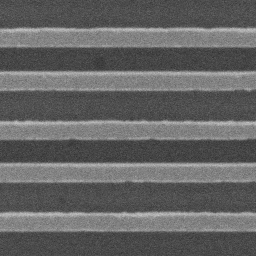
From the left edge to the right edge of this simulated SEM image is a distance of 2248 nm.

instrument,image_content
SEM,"lines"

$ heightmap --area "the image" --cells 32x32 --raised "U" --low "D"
DDDDDDDDDDDDDDDDDDDDDDDDDDDDDDDD
DDDDDDDDDDDDDDDDDDDDDDDDDDDDDDDD
DDDDDDDDDDDDDDDDDDDDDDDDDDDDDDDD
DDDDDDDDDDDDDDDDDDDDDDDDDDDDDDDD
UUUUUUUUUUUUUUUUUUUUUUUUUUUUUUUU
UUUUUUUUUUUUUUUUUUUUUUUUUUUUUUUU
DDDDDDDDDDDDDDDDDDDDDDDDDDDDDDDD
DDDDDDDDDDDDDDDDDDDDDDDDDDDDDDDD
DDDDDDDDDDDDDDDDDDDDDDDDDDDDDDDD
UUUUUUUUUUUUUUUUUUUUUUUUUUUUUUUU
UUUUUUUUUUUUUUUUUUUUUUUUUUUUUUUU
DDDDDDDDDDDDDDDDDDDDDDDDDDDDDDDD
DDDDDDDDDDDDDDDDDDDDDDDDDDDDDDDD
DDDDDDDDDDDDDDDDDDDDDDDDDDDDDDDD
DDDDDDDDDDDDDDDDDDDDDDDDDDDDDDDD
UUUUUUUUUUUUUUUUUUUUUUUUUUUUUUUU
UUUUUUUUUUUUUUUUUUUUUUUUUUUUUUUU
DDDDDDDDDDDDDDDDDDDDDDDDDDDDDDDD
DDDDDDDDDDDDDDDDDDDDDDDDDDDDDDDD
DDDDDDDDDDDDDDDDDDDDDDDDDDDDDDDD
UUUUUUUUUUDDUUUUDUUUUUUDDUUUDUUU
UUUUUUUUUUUUUUUUUUUUUUUUUUUUUUUU
UUUUUUUUUUUUUUUUUUUUUUUUUUUUUUUU
DDDDDDDDDDDDDDDDDDDDDDDDDDDDDDDD
DDDDDDDDDDDDDDDDDDDDDDDDDDDDDDDD
DDDDDDDDDDDDDDDDDDDDDDDDDDDDDDDD
DDDDDDDDDDDDDDDDDDDDDDDDDDDDDDDD
UUUUUUUUUUUUUUUUUUUUUUUUUUUUUUUU
UUUUUUUUUUUUUUUUUUUUUUUUUUUUUUUU
DDDDDDDDDDDDDDDDDDDDDDDDDDDDDDDD
DDDDDDDDDDDDDDDDDDDDDDDDDDDDDDDD
DDDDDDDDDDDDDDDDDDDDDDDDDDDDDDDD